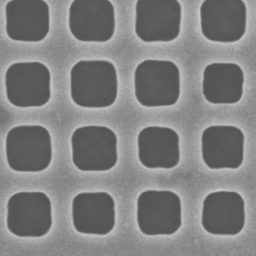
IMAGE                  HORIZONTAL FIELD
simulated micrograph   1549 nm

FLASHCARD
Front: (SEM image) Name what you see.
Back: a regular array of holes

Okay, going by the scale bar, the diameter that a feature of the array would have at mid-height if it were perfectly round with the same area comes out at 0.287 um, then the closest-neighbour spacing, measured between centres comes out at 387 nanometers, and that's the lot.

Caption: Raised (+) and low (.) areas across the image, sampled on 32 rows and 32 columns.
+.....+++.....+++.....+++......+
+.....+++.....+++......++......+
+.....+++.....+++......++......+
+.....+++.....+++.....+++......+
+.....+++.....+++.....++++....++
++++++++++++++++++++++++++++++++
++++++++++++++++++++++++++++++++
++++++++++++++++++++++++++++++++
+.....+++.....+++.....++++....++
+.....+++......++.....+++.....++
+.....+++......++.....+++.....++
+.....+++......++.....+++.....++
+.....+++.....+++.....++++....++
++++++++++++++++++++++++++++++++
++++++++++++++++++++++++++++++++
++++++++++++++++++++++++++++++++
+.....+++.....++++....+++.....++
+.....+++.....+++.....+++......+
+.....+++......++.....+++.....++
+.....+++......++.....+++.....++
+.....+++.....++++....++++....++
+++..+++++++++++++++++++++++++++
++++++++++++++++++++++++++++++++
++++++++++++++++++++++++++++++++
++....+++.....+++.....++++....++
+.....+++.....+++......++.....++
+.....+++.....+++......++......+
+.....+++.....+++......++......+
+.....++++....+++.....++++....++
++...+++++++++++++++++++++++++++
++++++++++++++++++++++++++++++++
++++++++++++++++++++++++++++++++